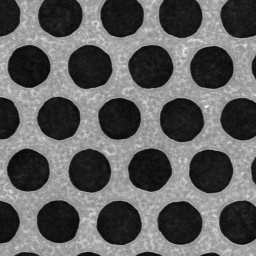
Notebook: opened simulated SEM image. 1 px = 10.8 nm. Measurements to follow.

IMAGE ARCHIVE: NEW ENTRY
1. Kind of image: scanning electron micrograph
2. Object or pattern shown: a regular array of holes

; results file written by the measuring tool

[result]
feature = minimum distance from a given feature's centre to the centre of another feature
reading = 644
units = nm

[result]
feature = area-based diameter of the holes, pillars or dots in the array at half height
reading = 470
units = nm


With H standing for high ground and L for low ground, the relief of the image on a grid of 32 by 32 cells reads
LLHHHLLLLLHHHLLLLLHHLLLLLHHHLLLL
LLLHHLLLLLHHHLLLLLHHLLLLLHHHLLLL
LLLHHLLLLLHHHLLLLLHHLLLLLHHHLLLL
LLHHHLLLLLHHHLLLLHHHLLLLLHHHLLLL
HHHHHHHLHHHHHHLLHHHHHHLLHHHHHLLL
HHHHHHHHHHHHHHHHHHHHHHHHHHHHHHHH
HHLLLLHHHLLLLHHHHLLLLHHHHLLLHHHH
HLLLLLHHHLLLLLHHLLLLLHHHLLLLLHHH
HLLLLLHHLLLLLLHHLLLLLLHHLLLLLHHL
HLLLLLHHHLLLLLHHLLLLLHHHLLLLLHHH
HHLLLHHHHLLLLHHHHLLLLHHHHLLLHHHH
HHHHHHHHHHHHHHHHHHHHHHHHHHHHHHHH
LHHHHHLLLHHHHHLLHHHHHHLLHHHHHLLH
LLHHHLLLLLHHHLLLLHHHLLLLLHHHLLLL
LLHHHLLLLLHHLLLLLLHHLLLLLHHHLLLL
LLHHHLLLLLHHLLLLLHHHLLLLLHHHLLLL
LLHHHLLLLHHHHLLLLHHHLLLLLHHHLLLL
HHHHHHHHHHHHHHHHHHHHHHLLHHHHHHLH
HHHHHHHHHHHHHHHHHHHHHHHHHHHHHHHH
HHLLLHHHHLLLLHHHHLLLLHHHLLLLHHHH
HLLLLLHHHLLLLLHHLLLLLHHHLLLLLHHL
HLLLLLHHHLLLLLHHLLLLLLHHLLLLLHHL
HLLLLLHHHLLLLLHHLLLLLHHHLLLLLHHH
HHLLLHHHHHLLLHHHHLLLHHHHHLLLHHHH
HHHHHHHHHHHHHHHHHHHHHHHHHHHHHHHH
LHHHHHLLLHHHHLLLHHHHHLLLHHHHHLLL
LLHHHLLLLLHHLLLLLHHHLLLLLHHHLLLL
LLHHHLLLLLHHLLLLLLHHLLLLLHHLLLLL
LLHHHLLLLLHHLLLLLLHHLLLLLHHLLLLL
LLHHHLLLLHHHHLLLLHHHLLLLLHHHLLLL
HHHHHHHHHHHHHHLLHHHHHHLHHHHHHHLH
HHHHHHHHHHHHHHHHHHLHHHHHHHHHHHHH